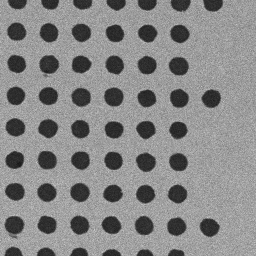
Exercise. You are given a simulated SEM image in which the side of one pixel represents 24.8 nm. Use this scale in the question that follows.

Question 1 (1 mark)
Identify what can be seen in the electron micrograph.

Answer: a regular array of holes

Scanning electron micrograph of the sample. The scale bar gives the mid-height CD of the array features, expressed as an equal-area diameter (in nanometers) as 467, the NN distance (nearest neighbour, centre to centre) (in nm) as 788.